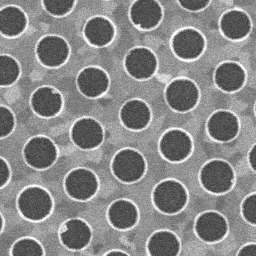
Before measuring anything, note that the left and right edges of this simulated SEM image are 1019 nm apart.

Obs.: a regular array of holes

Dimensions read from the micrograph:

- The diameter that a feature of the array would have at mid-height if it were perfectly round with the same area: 33.4 pixels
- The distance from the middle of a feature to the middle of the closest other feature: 200 nanometers